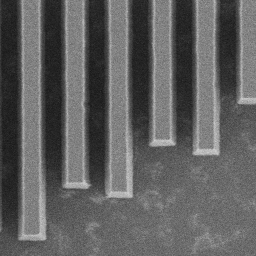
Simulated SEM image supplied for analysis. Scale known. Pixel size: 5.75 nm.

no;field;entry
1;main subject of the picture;parallel lines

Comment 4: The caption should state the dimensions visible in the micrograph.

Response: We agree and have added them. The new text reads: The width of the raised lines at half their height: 124 nm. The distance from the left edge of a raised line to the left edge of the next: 0.251 µm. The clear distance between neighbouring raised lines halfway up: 129 nanometres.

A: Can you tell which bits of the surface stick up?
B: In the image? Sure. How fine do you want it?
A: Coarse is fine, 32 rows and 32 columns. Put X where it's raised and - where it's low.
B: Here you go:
---XX---XXX--XXX---XXX--XXX---XX
---XX---XXX--XXX---XXX--XXX---XX
---XX---XXX--XXX---XXX--XXX---XX
---XX---XXX--XXX---XXX--XXX---XX
---XX---XXX--XXX---XXX--XXX---XX
---XX---XXX--XXX---XXX--XXX---XX
---XX---XXX--XXX---XXX--XXX---XX
---XX---XXX--XXX---XXX--XXX---XX
---XX---XXX--XXX---XXX--XXX---XX
---XX---XXX--XXX---XXX--XXX---XX
---XX---XXX--XXX---XXX--XXX---XX
---XX---XXX--XXX---XXX---XX---XX
---XX---XXX---XX---XXX---XX---XX
---XX---XXX---XX---XXX---XX-----
---XX---XXX---XX---XXX---XX-----
---XX---XXX---XX---XXX---XX-----
---XX---XXX---XX---XXX---XX-----
---XX---XXX---XX---XXX---XX-----
---XX---XXX---XX---------XX-----
---XX---XXX---XX----------------
---XX---XXX---XX----------------
---XX---XXX---XX----------------
---XX---XXX---XX----------------
---XX---------XX----------------
---XX---------------------------
---XX---------------------------
---XX---------------------------
---XX---------------------------
---XX---------------------------
---XX---------------------------
--------------------------------
--------------------------------